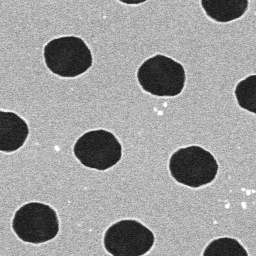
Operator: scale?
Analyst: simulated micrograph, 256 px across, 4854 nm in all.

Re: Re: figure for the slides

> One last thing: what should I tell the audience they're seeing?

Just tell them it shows holes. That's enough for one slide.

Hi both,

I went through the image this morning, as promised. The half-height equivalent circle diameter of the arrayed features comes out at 844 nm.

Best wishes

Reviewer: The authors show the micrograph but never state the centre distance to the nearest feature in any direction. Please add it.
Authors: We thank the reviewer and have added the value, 1820 nm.